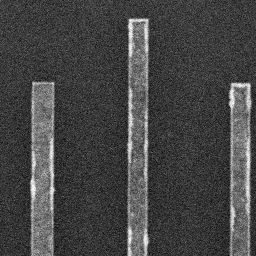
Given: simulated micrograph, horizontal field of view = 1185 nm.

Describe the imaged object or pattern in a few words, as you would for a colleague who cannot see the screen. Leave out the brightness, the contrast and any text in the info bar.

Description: one or a few lines or trenches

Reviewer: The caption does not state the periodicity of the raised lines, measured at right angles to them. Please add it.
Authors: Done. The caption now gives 458 nanometres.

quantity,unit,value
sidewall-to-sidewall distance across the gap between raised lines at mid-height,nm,366